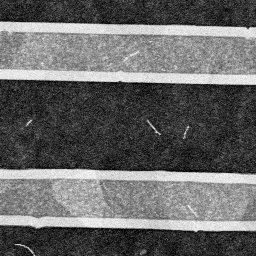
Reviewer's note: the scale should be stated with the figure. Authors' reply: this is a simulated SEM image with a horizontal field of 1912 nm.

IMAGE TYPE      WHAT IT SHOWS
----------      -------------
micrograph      one or a few lines or trenches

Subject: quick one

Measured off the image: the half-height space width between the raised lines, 742 nm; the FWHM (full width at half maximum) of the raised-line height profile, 350 nm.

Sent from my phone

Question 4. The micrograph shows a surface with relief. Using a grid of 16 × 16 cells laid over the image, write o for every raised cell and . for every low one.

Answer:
................
................
oooooooooooooooo
oooooooooooooooo
oooooooooooooooo
................
................
................
................
................
................
oooooooooooooooo
oooooooooooooooo
oooooooooooooooo
................
................